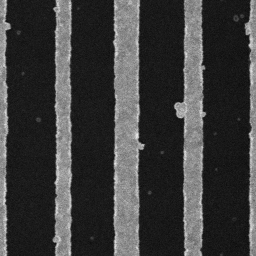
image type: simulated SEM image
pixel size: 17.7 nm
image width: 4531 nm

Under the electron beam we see one or a few lines or trenches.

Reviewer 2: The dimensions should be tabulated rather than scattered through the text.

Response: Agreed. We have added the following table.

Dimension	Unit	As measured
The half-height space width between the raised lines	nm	823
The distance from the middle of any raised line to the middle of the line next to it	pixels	64.2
